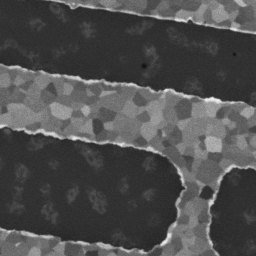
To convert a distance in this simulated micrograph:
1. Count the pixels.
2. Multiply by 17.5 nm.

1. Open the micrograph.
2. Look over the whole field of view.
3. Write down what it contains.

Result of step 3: one or a few lines or trenches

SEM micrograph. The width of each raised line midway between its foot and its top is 1080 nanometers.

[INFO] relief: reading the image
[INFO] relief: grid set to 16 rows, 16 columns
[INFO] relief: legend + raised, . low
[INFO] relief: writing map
......++++++++++
.............+++
................
................
+++.............
+++++++++.......
+++++++++++++++.
++++++++++++++++
....++++++++++++
..........++++++
...........+++++
...........+++..
...........++...
...........++...
+..........++...
+++++++...+++...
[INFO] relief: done